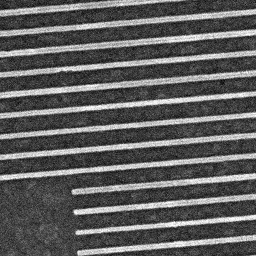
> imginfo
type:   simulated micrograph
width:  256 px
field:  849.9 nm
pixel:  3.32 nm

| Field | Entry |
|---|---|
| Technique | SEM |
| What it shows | parallel lines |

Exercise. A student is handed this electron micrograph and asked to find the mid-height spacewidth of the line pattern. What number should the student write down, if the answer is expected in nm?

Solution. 53.4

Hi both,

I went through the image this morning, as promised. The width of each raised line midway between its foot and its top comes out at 14.1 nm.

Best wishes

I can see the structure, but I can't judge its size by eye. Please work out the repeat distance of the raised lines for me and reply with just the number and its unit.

68 nanometers